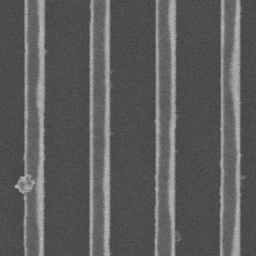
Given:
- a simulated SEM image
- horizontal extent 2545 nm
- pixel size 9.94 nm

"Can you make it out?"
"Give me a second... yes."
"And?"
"lines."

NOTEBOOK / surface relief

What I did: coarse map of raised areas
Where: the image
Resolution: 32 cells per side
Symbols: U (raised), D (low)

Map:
DDDUUDDDDDDUUUDDDDDDUUDDDDDDUUDD
DDDUUDDDDDDUUUDDDDDDUUDDDDDDUUDD
DDDUUDDDDDDUUUDDDDDDUUDDDDDDUUDD
DDDUUDDDDDDUUUDDDDDDUUDDDDDDUUDD
DDDUUDDDDDDUUUDDDDDDUUDDDDDDUUDD
DDDUUDDDDDDUUUDDDDDDUUDDDDDDUUDD
DDDUUDDDDDDUUUDDDDDDUUDDDDDDUUDD
DDDUUDDDDDDUUUDDDDDDUUDDDDDDUUDD
DDDUUDDDDDDUUUDDDDDDUUDDDDDDUUDD
DDDUUDDDDDDUUUDDDDDDUUDDDDDDUUDD
DDDUUDDDDDDUUUDDDDDDUUDDDDDDUUDD
DDDUUDDDDDDUUUDDDDDDUUDDDDDDUUDD
DDDUUDDDDDDUUUDDDDDDUUDDDDDDUUDD
DDDUUDDDDDDUUUDDDDDDUUDDDDDDUUDD
DDDUUDDDDDDUUUDDDDDDUUDDDDDDUUDD
DDDUUDDDDDDUUUDDDDDDUUDDDDDDUUDD
DDDUUDDDDDDUUUDDDDDDUUDDDDDDUUDD
DDDUUDDDDDDUUUDDDDDDUUDDDDDDUUDD
DDDUUDDDDDDUUUDDDDDDUUDDDDDDUUDD
DDDUUDDDDDDUUUDDDDDDUUDDDDDDUUDD
DDDUUDDDDDDUUUDDDDDDUUDDDDDDUUDD
DDDUUDDDDDDUUUDDDDDDUUDDDDDDUUDD
DDUUUDDDDDDUUUDDDDDUUUDDDDDDUUDD
DDUUUDDDDDDUUUDDDDDUUUDDDDDDUUDD
DDDUUDDDDDDUUUDDDDDDUUDDDDDDUUDD
DDDUUDDDDDDUUUDDDDDUUUDDDDDDUUDD
DDDUUDDDDDDUUUDDDDDUUUDDDDDDUUDD
DDDUUDDDDDDUUUDDDDDUUUDDDDDDUUDD
DDDUUDDDDDDUUUDDDDDUUUDDDDDDUUDD
DDDUUDDDDDDUUUDDDDDUUUDDDDDDUUDD
DDDUUDDDDDDUUUDDDDDUUUDDDDDDUUDD
DDDUUDDDDDDUUUDDDDDUUUDDDDDDUUDD